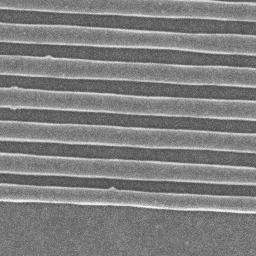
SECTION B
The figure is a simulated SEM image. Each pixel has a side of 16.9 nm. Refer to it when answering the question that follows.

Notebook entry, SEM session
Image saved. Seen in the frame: parallel lines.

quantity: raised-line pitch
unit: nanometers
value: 541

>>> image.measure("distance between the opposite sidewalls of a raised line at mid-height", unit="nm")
300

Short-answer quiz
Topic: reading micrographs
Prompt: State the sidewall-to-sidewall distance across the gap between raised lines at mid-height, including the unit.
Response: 239 nm